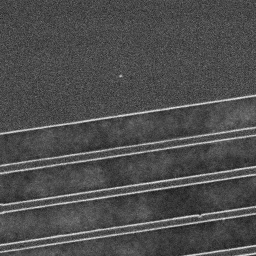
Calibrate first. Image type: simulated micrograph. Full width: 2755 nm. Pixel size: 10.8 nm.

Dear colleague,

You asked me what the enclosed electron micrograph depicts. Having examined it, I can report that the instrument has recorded parallel lines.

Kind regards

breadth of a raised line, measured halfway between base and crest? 82.5 nanometres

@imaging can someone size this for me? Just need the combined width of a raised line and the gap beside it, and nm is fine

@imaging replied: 420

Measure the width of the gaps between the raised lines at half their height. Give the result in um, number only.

0.339